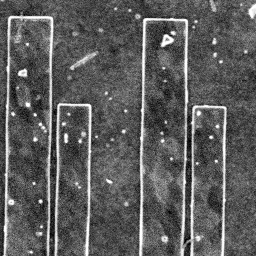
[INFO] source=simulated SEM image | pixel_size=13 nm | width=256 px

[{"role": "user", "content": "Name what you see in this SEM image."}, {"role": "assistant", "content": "wiring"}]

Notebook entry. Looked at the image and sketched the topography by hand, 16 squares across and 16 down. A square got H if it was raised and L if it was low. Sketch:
LLLLLLLLLLLLLLLL
LHHLLLLLLHHHLLLL
LHHLLLLLLHHHLLLL
LHHLLLLLLHHHLLLL
LHHLLLLLLHHHLLLL
LHHLLLLLLHHHLLLL
HHHLLLLLLHHHLLLL
HHHHHHLLLHHHHHLL
HHHHHHLLLHHHHHLL
HHHHHHLLLHHHHHLL
HHHHHHLLLHHHHHLL
HHHHHHLLLHHHHHLL
HHHHHHLLLHHHHHLL
HHHHHHLLLHHLHHLL
HHHHHLLLLHHLHHLL
HHHHHLLLLHHLHHLL